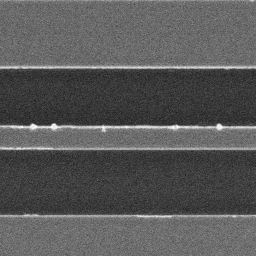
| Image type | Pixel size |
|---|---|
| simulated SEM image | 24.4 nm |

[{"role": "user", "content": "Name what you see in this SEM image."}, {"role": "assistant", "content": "lines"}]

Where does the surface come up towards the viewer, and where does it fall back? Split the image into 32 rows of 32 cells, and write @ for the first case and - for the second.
@@@@@@@@@@@@@@@@@@@@@@@@@@@@@@@@
@@@@@@@@@@@@@@@@@@@@@@@@@@@@@@@@
@@@@@@@@@@@@@@@@@@@@@@@@@@@@@@@@
@@@@@@@@@@@@@@@@@@@@@@@@@@@@@@@@
@@@@@@@@@@@@@@@@@@@@@@@@@@@@@@@@
@@@@@@@@@@@@@@@@@@@@@@@@@@@@@@@@
@@@@@@@@@@@@@@@@@@@@@@@@@@@@@@@@
@@@@@@@@@@@@@@@@@@@@@@@@@@@@@@@@
--------------------------------
--------------------------------
--------------------------------
--------------------------------
--------------------------------
--------------------------------
--------------------------------
--------------------------------
@@@@@@@@@@@@@@@@@@@@@@@@@@@@@@@@
@@@@@@@@@@@@@@@@@@@@@@@@@@@@@@@@
@@@---@@@@@@@@@@@@@@@@@@@@@@@@@@
--------------------------------
--------------------------------
--------------------------------
--------------------------------
--------------------------------
--------------------------------
--------------------------------
--------------------------------
@@@@@@@@@@@@@@@@@@@@@@@@@@@@@@@@
@@@@@@@@@@@@@@@@@@@@@@@@@@@@@@@@
@@@@@@@@@@@@@@@@@@@@@@@@@@@@@@@@
@@@@@@@@@@@@@@@@@@@@@@@@@@@@@@@@
@@@@@@@@@@@@@@@@@@@@@@@@@@@@@@@@